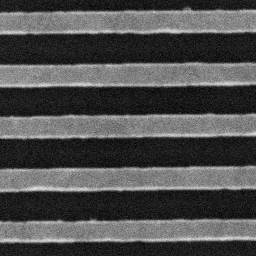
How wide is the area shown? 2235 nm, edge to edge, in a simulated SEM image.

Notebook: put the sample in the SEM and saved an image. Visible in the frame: lines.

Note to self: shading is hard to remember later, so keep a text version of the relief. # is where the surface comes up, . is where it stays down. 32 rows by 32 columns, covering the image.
................................
...............##.##############
################################
################################
................................
................................
................................
................................
################################
################################
##############################..
................................
................................
................................
...................#############
################################
################################
................................
................................
................................
................................
################################
################################
################################
................................
................................
................................
................................
################################
################################
................................
................................